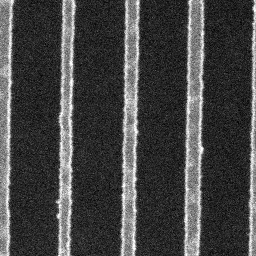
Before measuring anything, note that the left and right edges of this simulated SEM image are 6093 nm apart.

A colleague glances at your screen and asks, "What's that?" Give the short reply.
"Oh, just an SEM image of one or a few lines or trenches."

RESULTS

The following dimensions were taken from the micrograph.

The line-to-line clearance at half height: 1.23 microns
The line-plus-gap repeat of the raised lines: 64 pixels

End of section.